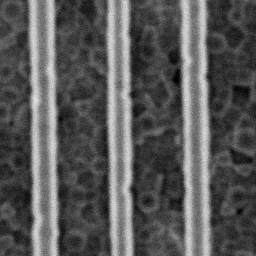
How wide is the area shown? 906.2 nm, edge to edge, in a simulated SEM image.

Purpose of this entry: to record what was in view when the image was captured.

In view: one or a few lines or trenches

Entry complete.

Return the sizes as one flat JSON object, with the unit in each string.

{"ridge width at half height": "0.0651 µm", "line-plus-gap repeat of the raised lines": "269 nanometers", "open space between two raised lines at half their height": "207 nm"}